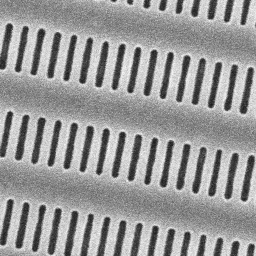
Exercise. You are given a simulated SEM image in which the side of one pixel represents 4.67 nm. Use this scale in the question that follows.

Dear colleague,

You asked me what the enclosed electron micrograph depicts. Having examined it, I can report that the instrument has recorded a regular array of holes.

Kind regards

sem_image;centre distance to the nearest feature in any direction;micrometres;0.0759